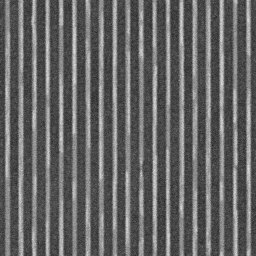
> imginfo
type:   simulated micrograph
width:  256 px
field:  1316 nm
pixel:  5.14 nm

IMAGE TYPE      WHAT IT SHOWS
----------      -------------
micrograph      parallel lines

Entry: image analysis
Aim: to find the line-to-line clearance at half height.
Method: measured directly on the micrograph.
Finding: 48.8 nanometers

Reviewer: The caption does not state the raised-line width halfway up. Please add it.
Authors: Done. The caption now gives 0.0225 micrometres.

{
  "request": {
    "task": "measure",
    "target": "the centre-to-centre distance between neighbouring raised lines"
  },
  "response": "68.8 nanometres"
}